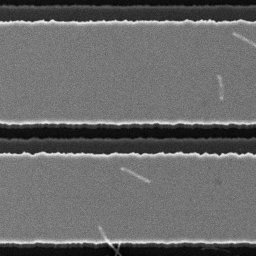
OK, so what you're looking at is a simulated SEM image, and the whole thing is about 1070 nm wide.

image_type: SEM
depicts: lines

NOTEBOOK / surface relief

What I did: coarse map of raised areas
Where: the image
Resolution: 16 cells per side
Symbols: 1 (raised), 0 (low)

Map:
0000000000000000
1111111111111111
1111111111111111
1111111111111111
1111111111111111
1111111111111111
1111111111111111
1111111111111111
0000000000000000
0000000000000000
1111111111111111
1111111111111111
1111111111111111
1111111111111111
1111111111111111
0000000000000000